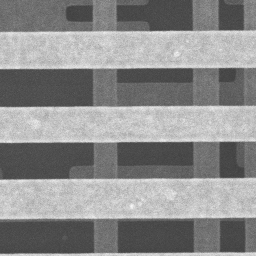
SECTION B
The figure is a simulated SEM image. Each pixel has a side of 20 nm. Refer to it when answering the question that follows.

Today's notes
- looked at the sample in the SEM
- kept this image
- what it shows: wiring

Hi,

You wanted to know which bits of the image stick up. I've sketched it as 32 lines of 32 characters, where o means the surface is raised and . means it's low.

............oo...........oo....o
............oo...........oo....o
............oo...........oo....o
............oo...........oo....o
oooooooooooooooooooooooooooooooo
oooooooooooooooooooooooooooooooo
oooooooooooooooooooooooooooooooo
oooooooooooooooooooooooooooooooo
ooooooooooooooooo.......ooo....o
............oo...........oo....o
............oo...........oo....o
............oo...........oo....o
............oo...........oo....o
oooooooooooooooooooooooooooooooo
oooooooooooooooooooooooooooooooo
oooooooooooooooooooooooooooooooo
oooooooooooooooooooooooooooooooo
oooooooooooooooooooooooooooooooo
............oo...........oo....o
............oo...........oo....o
............oo...........oo....o
............oo...........oo....o
.ooooooooooooooooooooooooooooooo
oooooooooooooooooooooooooooooooo
oooooooooooooooooooooooooooooooo
oooooooooooooooooooooooooooooooo
oooooooooooooooooooooooooooooooo
............oo...........oo....o
............oo...........oo....o
............oo...........oo....o
............oo...........oo....o
............oo..........ooo....o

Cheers